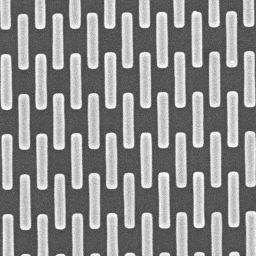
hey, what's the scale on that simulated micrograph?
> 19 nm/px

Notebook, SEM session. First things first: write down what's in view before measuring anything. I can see groups of lines, slits or small figures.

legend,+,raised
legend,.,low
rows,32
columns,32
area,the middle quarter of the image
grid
..++..++..+++..++..+++.+++..++..
..++......+++......+++......++..
..++......+++......+++......++..
..++.......++......+++......++..
..++.......++......+++......++..
..++.......++......+++......++..
..++.......++......+++......++..
..++.......++..++..+++..++..++..
..++..+++..++..++..+++.+++..++..
..++..+++..++..++..+++.+++..++..
..++..+++..++..++..+++.+++..++..
......+++......++......+++......
......+++......++......+++......
......+++......++.......++......
......+++......++.......++......
......+++......++.......++......
......+++......++.......++......
...+..+++..++..++...+...++..++..
..++..+++..++..++..+++..++..++..
..++..+++..++..++..+++..++..++..
..++..+++..++..++..+++..++..++..
..++.......++......+++......++..
..++.......++......+++......++..
..++.......++......+++......++..
..++.......++......+++......++..
..++.......++......+++......++..
..+++......++......+++......++..
..+++..+...++..++..+++..++..++..
..+++.+++..++..++..+++..++..++..
..+++.+++..++..++...++..++..++..
..+++.+++..++..++...++..++..++..
......+++......++.......++......